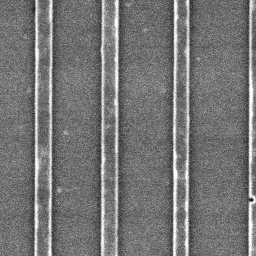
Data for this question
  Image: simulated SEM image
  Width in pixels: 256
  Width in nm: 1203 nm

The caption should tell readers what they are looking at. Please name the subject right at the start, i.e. one or a few lines or trenches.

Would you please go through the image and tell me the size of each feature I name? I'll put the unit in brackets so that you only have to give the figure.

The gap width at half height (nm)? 270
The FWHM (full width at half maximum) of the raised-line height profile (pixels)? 15.1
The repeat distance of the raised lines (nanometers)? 324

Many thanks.